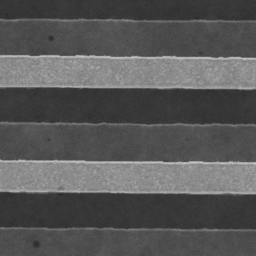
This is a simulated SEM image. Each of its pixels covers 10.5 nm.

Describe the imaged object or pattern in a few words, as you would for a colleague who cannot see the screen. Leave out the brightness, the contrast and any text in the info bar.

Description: lines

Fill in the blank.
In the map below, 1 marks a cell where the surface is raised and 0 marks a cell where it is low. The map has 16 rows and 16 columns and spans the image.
0000000000000000
1111111111111111
1111111111111111
1111111111111111
1111111111111111
0000000001111111
0000000000000000
0000000000000000
1111111111111111
1111111111111111
1111111111111111
1111111111111111
0000000000000000
0000000000000000
1111111111111111
1111111111111111